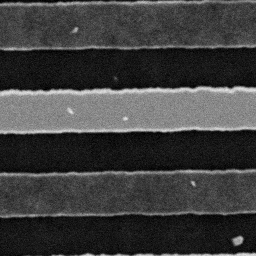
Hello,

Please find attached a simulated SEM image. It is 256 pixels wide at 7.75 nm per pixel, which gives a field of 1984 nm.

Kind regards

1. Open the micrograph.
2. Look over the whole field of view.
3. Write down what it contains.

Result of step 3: lines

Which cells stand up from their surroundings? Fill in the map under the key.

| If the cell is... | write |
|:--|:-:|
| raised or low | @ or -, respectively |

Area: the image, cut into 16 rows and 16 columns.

@@@@@@@@@@@@@@@@
@@@@@@@@@@@@@@@@
@@@@@@@@@@@@@@@@
----------------
----------------
-----------@@@@@
@@@@@@@@@@@@@@@@
@@@@@@@@@@@@@@@@
----------------
----------------
----------------
@@@@@@@@@@@@@@@@
@@@@@@@@@@@@@@@@
@@@-------------
----------------
----------------